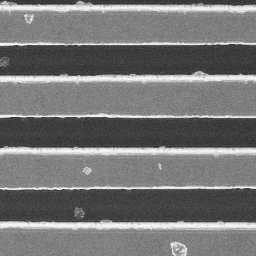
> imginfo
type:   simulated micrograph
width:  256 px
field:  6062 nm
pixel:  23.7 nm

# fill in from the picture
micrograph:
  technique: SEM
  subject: lines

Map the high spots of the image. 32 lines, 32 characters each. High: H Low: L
LLLLLLLLLLLLLLLLLLLLLLLLLLLLLLLL
HHHHHHHHHHHHHHHHHHHHHHHHHHHHHHHH
HHHHHHHHHHHHHHHHHHHHHHHHHHHHHHHH
HHHHHHHHHHHHHHHHHHHHHHHHHHHHHHHH
HHHHHHHHHHHHHHHHHHHHHHHHHHHHHHHH
HHHHHHHHHHHHHHHHHHHHHHHHHHHHHLHH
LLLLLLLLLLLLLLLLLLLLLLLLLLLLLLLL
LLLLLLLLLLLLLLLLLLLLLLLLLLLLLLLL
LLLLLLLLLLLLLLLLLLLLLLLLLLLLLLLL
LLLLLLLLLLLLLLLLLLLLLLLLLLLLLLHL
HHHHHHHHHHHHHHHHHHHHHHHHHHHHHHHH
HHHHHHHHHHHHHHHHHHHHHHHHHHHHHHHH
HHHHHHHHHHHHHHHHHHHHHHHHHHHHHHHH
HHHHHHHHHHHHHHHHHHHHHHHHHHHHHHHH
HHHHHHHHHHHHHHHHHHHHHHHHHHHHHHHH
LLLLLLLLLLLLLLLLLLLLLLLLLLLLLLLL
LLLLLLLLLLLLLLLLLLLLLLLLLLLLLLLL
LLLLLLLLLLLLLLLLLLLLLLLLLLLLLLLL
LLLLLLLLLLLLLLLLLLLLLLLLLLLLLLLL
HHHHHHHHHHHHHHHHHHHHHHHHHHHHHHHH
HHHHHHHHHHHHHHHHHHHHHHHHHHHHHHHH
HHHHHHHHHHHHHHHHHHHHHHHHHHHHHHHH
HHHHHHHHHHHHHHHHHHHHHHHHHHHHHHHH
HHHHHHHHHHHHHHHHHHHHHHHHHHHHHHLH
LLLLLLLLLLLLLLLLLLLLLLLLLLLLLLLL
LLLLLLLLLLLLLLLLLLLLLLLLLLLLLLLL
LLLLLLLLLLLLLLLLLLLLLLLLLLLLLLLL
LLLLLLLLLLLLLLLLLLLLLLLLLLLLLLLL
HHHHHHHHHHHHHHHHHHHHHHHHHHHHHHHH
HHHHHHHHHHHHHHHHHHHHHHHHHHHHHHHH
HHHHHHHHHHHHHHHHHHHHHHHHHHHHHHHH
HHHHHHHHHHHHHHHHHHHHHHHHHHHHHHHH